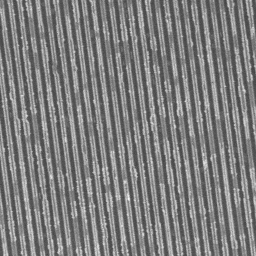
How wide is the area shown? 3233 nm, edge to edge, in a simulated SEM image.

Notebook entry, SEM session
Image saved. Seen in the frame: parallel lines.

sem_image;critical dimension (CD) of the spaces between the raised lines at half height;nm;61.1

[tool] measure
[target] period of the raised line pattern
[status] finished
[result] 0.115 micrometres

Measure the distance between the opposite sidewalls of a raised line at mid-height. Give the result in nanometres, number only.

61.1